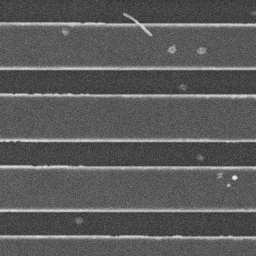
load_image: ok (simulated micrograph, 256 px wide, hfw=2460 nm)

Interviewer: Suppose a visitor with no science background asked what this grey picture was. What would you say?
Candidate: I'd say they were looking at lines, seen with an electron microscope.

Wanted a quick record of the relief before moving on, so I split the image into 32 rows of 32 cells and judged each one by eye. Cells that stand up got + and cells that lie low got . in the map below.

................................
................................
................................
++++++++++++++++++++++++++++++++
++++++++++++++++++++++++++++++++
++++++++++++++++++++++++++++++++
++++++++++++++++++++++++++++++++
++++++++++++++++++++++++++++++++
++++++++++++++++++++++++++++++++
................................
................................
................................
++++++++++++++++++++++++++++++++
++++++++++++++++++++++++++++++++
++++++++++++++++++++++++++++++++
++++++++++++++++++++++++++++++++
++++++++++++++++++++++++++++++++
++++++++++++++++++++++++++++++++
................................
................................
................................
++++++++++++++++++++++++++++++++
++++++++++++++++++++++++++++++++
++++++++++++++++++++++++++++++++
++++++++++++++++++++++++++++++++
++++++++++++++++++++++++++++++++
................................
................................
................................
................................
++++++++++++++++++++++++++++++++
++++++++++++++++++++++++++++++++